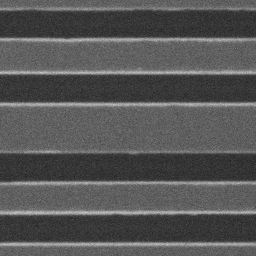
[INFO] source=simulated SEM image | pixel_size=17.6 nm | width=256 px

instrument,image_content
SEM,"lines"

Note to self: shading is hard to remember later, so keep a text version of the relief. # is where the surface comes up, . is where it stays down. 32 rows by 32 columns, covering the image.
################################
................................
................................
................................
................................
################################
################################
################################
################################
................................
................................
................................
................................
################################
################################
################################
################################
################################
################################
................................
................................
................................
................................
################################
################################
################################
################################
................................
................................
................................
...######.######################
################################